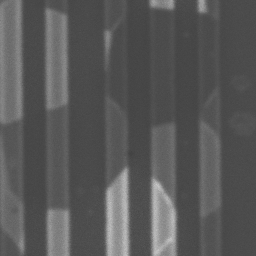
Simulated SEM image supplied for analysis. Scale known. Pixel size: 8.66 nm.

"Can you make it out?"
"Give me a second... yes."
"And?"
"wiring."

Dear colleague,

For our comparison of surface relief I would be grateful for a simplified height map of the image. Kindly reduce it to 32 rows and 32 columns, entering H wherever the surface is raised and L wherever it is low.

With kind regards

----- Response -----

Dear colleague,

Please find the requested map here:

HHHLLLHHLLLLLHHHLLLHHHLLLHHLLLLL
HHHLLLHHLLLLLHHHLLLHHHLLLHHLLLLL
HHHLLLHHLLLLLHHHLLLHHHLLLHHLLLLL
HHHLLLHHLLLLLHHHLLLHHHLLLHHLLLLL
HHHLLLHHLLLLLHHHLLLHHHLLLHHLLLLL
HHHLLLHHLLLLLHHHLLLHHHLLLHHLLLLL
HHHLLLHHLLLLLHHHLLLHHHLLLHHLLLLL
HHHLLLHHLLLLLHHHLLLHHHLLLHHLLLLL
HHHLLLHHLLLLLHHHLLLHHHLLLHHLLLLL
HHHLLLHHLLLLLHHHLLLHHHLLLHHLLLLL
HHHLLLHHLLLLLHHHLLLHHHLLLHHLLLLL
HHHLLLHHLLLLLHHHLLLHHHLLLHHLLLLL
HHHLLLHHLLLLLHHHLLLHHHLLLHHLLLLL
HHHLLLHHLLLLLHHHLLLHHHLLLHHLLLLL
HHHLLLHHLLLLLHHHLLLHHHLLLHHLLLLL
HHHLLLHHLLLLLHHHLLLHHHLLLHHLLLLL
HHHLLLHHLLLLLHHHLLLHHHLLLHHLLLLL
HHHLLLHHLLLLLHHHLLLHHHLLLHHLLLLL
HHHLLLHHLLLLLHHHLLLHHHLLLHHLLLLL
HHHLLLHHLLLLLHHHLLLHHHLLLHHLLLLL
HHHLLLHHLLLLLHHHLLLHHHLLLHHLLLLL
HHHLLLHHLLLLLHHHLLLHHHLLLHHLLLLL
HHHLLLHHLLLLLHHHLLLHHHLLLHHLLLLL
HHHLLLHHLLLLLHHHLLLHHHLLLHHLLLLL
HHHLLLHHHLLLLHHHLLLHHHLLLHHLLLLL
HHHLLLHHHLLLLHHHLLLHHHLLLHHLLLLL
HHHLLLHHHLLLLHHHLLLHHHLLLHHLLLLL
HHHLLLHHHLLLLHHHLLLHHHLLLHHLLLLL
HHHLLLHHHLLLLHHHLLLHHHLLLHHLLLLL
HHHLLLHHHLLLLHHHLLLHHHLLLHHLLLLL
HHHLLLHHHLLLLHHHLLLHHHLLLHHLLLLL
HHHLLLHHHLLLLLHHLLLHHHLLLHHLLLLL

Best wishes